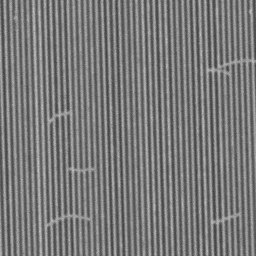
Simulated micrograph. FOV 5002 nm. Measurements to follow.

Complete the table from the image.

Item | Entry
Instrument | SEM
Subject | parallel lines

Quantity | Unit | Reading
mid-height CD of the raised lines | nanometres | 53.7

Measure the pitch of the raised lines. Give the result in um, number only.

0.112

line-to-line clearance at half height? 0.0733 micrometres